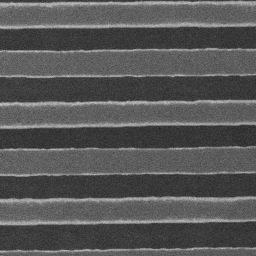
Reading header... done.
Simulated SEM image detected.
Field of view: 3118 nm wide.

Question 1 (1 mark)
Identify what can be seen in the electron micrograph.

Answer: lines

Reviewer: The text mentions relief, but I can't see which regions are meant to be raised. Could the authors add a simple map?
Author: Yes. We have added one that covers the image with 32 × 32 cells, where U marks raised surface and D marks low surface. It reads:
UUUUUUUUUUUUUUUUUUUUUUUUUUUUUUUU
UUUUUUUUUUUUUUUUUUUUUUUUUUUUUUUU
UUUUUUUUUUUUUUUUUUUUUUUUUUUUUUUU
UDDDDDDDDDDDDDDDDDDDDDDDDDDDDDDD
DDDDDDDDDDDDDDDDDDDDDDDDDDDDDDDD
DDDDDDDDDDDDDDDDDDDDDDDDDDDDDDDD
UUUUUUUUUUUUUUUUUUUUUUUUUUUUUUUU
UUUUUUUUUUUUUUUUUUUUUUUUUUUUUUUU
UUUUUUUUUUUUUUUUUUUUUUUUUUUUUUUU
UUUUUUUUUUUUUUUUUUUDDUDDDDDDDDDD
DDDDDDDDDDDDDDDDDDDDDDDDDDDDDDDD
DDDDDDDDDDDDDDDDDDDDDDDDDDDDDDDD
DDDDDDDDDDDDDDDDDDDDDDDDDDDDDDDD
UUUUUUUUUUUUUUUUUUUUUUUUUUUUUUUU
UUUUUUUUUUUUUUUUUUUUUUUUUUUUUUUU
UUUUUUUUUUUUUUUUUUUUUUUUUUUUUUUU
DDDDDDDDDDDDDDDDDDDDDDDDDDDDDDDD
DDDDDDDDDDDDDDDDDDDDDDDDDDDDDDDD
DDDDDDDDDDDDDDDDDDDDDDDDUUUUUUUU
UUUUUUUUUUUUUUUUUUUUUUUUUUUUUUUU
UUUUUUUUUUUUUUUUUUUUUUUUUUUUUUUU
UUUUUUUUUUUUUUUUUUUUUUUUUUUUUUUU
DDDDDDDDDDDDDDDDDDDDDDDDDDDDDDDD
DDDDDDDDDDDDDDDDDDDDDDDDDDDDDDDD
DDDDDDDDDDDDDDDDDDDDDDDDDDDDDDDD
UUUUUUUUUUUUUUUUUUUUUUUUUUUUUUUU
UUUUUUUUUUUUUUUUUUUUUUUUUUUUUUUU
UUUUUUUUUUUUUUUUUUUUUUUUUUUUUUUU
DDDDDDDDDDDDDDDDDDDDDDDDDDDDDDDD
DDDDDDDDDDDDDDDDDDDDDDDDDDDDDDDD
DDDDDDDDDDDDDDDDDDDDDDDDDDDDDDDD
UUUUUUUUUUUUUUUUUUUUUUUUUUUUUUUU